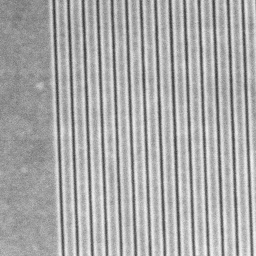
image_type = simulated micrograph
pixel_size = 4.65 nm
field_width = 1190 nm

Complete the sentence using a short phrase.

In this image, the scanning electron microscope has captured parallel lines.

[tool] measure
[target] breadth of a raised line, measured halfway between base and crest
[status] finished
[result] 51.7 nm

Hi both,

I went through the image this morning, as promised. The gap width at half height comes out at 15.7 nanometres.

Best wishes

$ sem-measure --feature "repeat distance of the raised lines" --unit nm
67.6